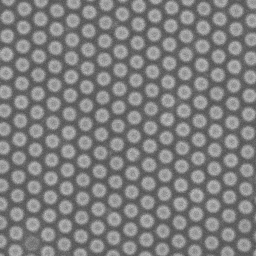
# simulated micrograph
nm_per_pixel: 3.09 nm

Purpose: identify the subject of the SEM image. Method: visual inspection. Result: a regular array of raised bodies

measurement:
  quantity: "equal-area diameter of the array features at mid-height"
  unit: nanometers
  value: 38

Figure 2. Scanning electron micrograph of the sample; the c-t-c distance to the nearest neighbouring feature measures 0.0571 µm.